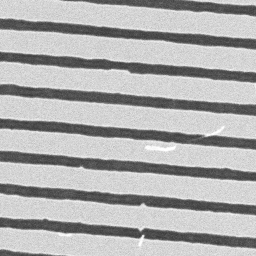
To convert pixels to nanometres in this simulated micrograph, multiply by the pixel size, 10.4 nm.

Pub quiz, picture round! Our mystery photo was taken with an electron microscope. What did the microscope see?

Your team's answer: parallel lines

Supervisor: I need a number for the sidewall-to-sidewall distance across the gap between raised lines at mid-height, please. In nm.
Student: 93.1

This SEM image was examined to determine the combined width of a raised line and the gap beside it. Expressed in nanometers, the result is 343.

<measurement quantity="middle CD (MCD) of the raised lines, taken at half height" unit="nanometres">250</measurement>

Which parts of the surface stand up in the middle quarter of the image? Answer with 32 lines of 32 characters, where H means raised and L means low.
LLLLLLLLLLLLLLLLLLLLLLLLLLLHHHHH
HHHHHHHHHHHHHHHLLLLLLLLLLLLLLLLL
HHHHHHHHHHHHHHHHHHHLHHLLLLLLLLLL
HHHHHHHHHHHHHHHHHHHHHHHHHHHHHHHH
HHHHHHHHHHHHHHHHHHHHHHHHHHHHHHHH
HHHHHHHHHHHHHHHHHHHHHHHHHHHHHHHH
LLHHHHHHHHHHHHHHHHHHHHHHHHHHHHHH
LLLLLLLLLLLLLLHHHHHHHHHHHHHHHHHH
LLLLLLLLLLLLLLLLLLLLLLLLLHHHHHHH
HHHHHHLLLLLLLLLLLLLLLLLLLLLLLLLL
HHHHHHHHHHHHHHHHHHLLLLLLLLLLLLLL
HHHHHHHHHHHHHHHHHHHHHHHHHHHHHHLH
HHHHHHHHHHHHHHHHHHHHHHHHHHHHHHHH
HHHHHHHHHHHHHHHHHHHHHHHHHHHHHHHH
HHHHHHHHHHHHHHHHHHHHHHHHHHHHHHHH
LLLLLLLLHHHHHHHHHHHHHHHHHHHHHHHH
LLLLLLLLLLLLLLLLLLLLHHLHHHHHHHHH
HHHLLLLLLLLLLLLLLLLLLLLLLLLLLLHH
HHHHHHHHHHHHHHHLLLLLLLLLLLLLLLLL
HHHHHHHHHHHHHHHHHHHHHHHHHLHLLLLL
HHHHHHHHHHHHHHHHHHHHHHHHHHHHHHHH
HHHHHHHHHHHHHHHHHHHHHHHHHHHHHHHH
HHHHHHHHHHHHHHHHHHHHHHHHHHHHHHHH
LLLLLHHHHHHHHHHHHHHHHHHHHHHHHHHH
LLLLLLLLLLLLLLLLLLLHHHHHHHHHHHHH
LLLLLLLLLLLLLLLLLLLLLLLLLLLLLHHH
HHHHHHHHHLLLLLLLLLLLLLLLLLLLLLLL
HHHHHHHHHHHHHHHHHHHHHHHHLLLLLLLL
HHHHHHHHHHHHHHHHHHHHHHHHHHHHHHHH
HHHHHHHHHHHHHHHHHHHHHHHHHHHHHHHH
HHHHHHHHHHHHHHHHHHHHHHHHHHHHHHHH
LLLHHHHHHHHHHHHHHHHHHHHHHHHHHHHH